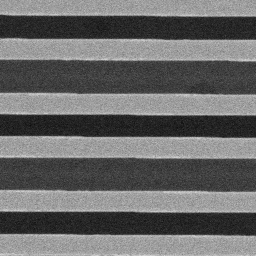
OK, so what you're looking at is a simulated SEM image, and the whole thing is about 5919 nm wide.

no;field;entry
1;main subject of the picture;lines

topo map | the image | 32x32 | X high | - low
XXXXXXXXXXXXXXXXXXXXXXXXXXXXXXXX
XXXXXXXXXXXXXXXXXXXXXXXXXXXXXXXX
--------------------------------
--------------------------------
--------------------------------
XXXXXXXXXXXXXXXXXXXXXXXXXXXXXXXX
XXXXXXXXXXXXXXXXXXXXXXXXXXXXXXXX
----------------------------XXXX
--------------------------------
--------------------------------
--------------------------------
--------------------------------
XXXXXXXXXXXXXXXXXXXXXXXXXXXXXXXX
XXXXXXXXXXXXXXXXXXXXXXXXXXXXXXXX
--------------------------------
--------------------------------
--------------------------------
XXXXXXXXXXXXXXXXXXXXXXXXXXXXXXXX
XXXXXXXXXXXXXXXXXXXXXXXXXXXXXXXX
XXXXXXXXXXXXXXXXXXXXXXXXXXXXXXXX
--------------------------------
--------------------------------
--------------------------------
--------------------------------
XXXXXXXXXXXXXXXXXXXXXXXXXXXXXXXX
XXXXXXXXXXXXXXXXXXXXXXXXXXXXXXXX
--------------------------------
--------------------------------
--------------------------------
XXXXXXXXXXXXXXXXXXXXXXXXXXXXXXX-
XXXXXXXXXXXXXXXXXXXXXXXXXXXXXXXX
XXXXXXXXXXXXXXXXXXXXXXXXXXXXXXXX